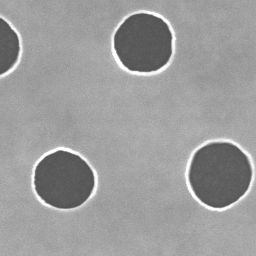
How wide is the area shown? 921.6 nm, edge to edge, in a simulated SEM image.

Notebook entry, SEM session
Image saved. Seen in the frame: holes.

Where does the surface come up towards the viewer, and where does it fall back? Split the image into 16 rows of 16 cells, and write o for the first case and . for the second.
oooooooooooooooo
oooooooo..oooooo
.oooooo....ooooo
.oooooo....ooooo
oooooooooooooooo
oooooooooooooooo
oooooooooooooooo
oooooooooooooooo
oooooooooooooooo
ooo.oooooooo...o
oo....oooooo....
oo....oooooo....
ooo..oooooooo..o
oooooooooooooooo
oooooooooooooooo
oooooooooooooooo